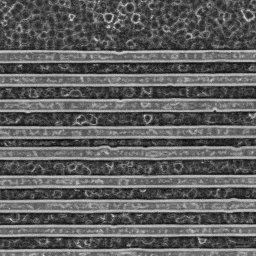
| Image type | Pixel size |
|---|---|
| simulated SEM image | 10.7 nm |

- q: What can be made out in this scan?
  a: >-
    parallel lines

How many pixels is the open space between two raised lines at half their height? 14.9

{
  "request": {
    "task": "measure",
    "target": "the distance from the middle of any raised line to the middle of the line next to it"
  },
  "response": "0.266 µm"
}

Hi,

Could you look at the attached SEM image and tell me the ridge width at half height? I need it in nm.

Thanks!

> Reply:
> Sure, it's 110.